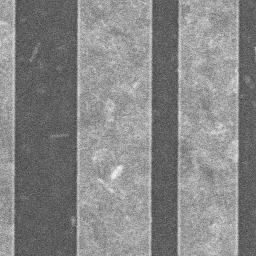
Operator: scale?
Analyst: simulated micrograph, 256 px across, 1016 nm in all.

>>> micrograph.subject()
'one or a few lines or trenches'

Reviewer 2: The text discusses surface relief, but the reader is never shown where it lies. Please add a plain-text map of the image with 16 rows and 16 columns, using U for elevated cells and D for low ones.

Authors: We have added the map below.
UDDDDUUUUDDUUUUD
UDDDDUUUUDDUUUUD
UDDDDUUUUDDUUUUD
UDDDDUUUUDDUUUUD
UDDDDUUUUDDUUUUD
UDDDDUUUUDDUUUUD
UDDDDUUUUDDUUUUD
UDDDDUUUUDDUUUUD
UDDDDUUUUDDUUUUD
UDDDDUUUUDDUUUUD
UDDDDUUUUDDUUUUD
UDDDDUUUUDDUUUUD
UDDDDUUUUDDUUUUD
UDDDDUUUUDDUUUUD
UDDDDUUUUDDUUUUD
UDDDDUUUUDDUUUUD